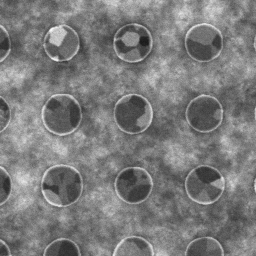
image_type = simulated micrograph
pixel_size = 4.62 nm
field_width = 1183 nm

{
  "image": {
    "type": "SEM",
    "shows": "a regular array of raised bodies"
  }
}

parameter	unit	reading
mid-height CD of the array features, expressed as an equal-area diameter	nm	177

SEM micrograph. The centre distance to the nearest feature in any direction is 70.9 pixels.